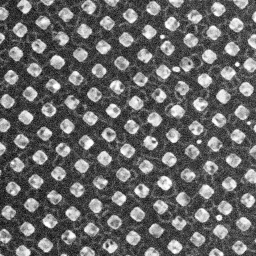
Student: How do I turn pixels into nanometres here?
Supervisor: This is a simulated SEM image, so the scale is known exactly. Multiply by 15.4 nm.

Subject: a regular array of raised bodies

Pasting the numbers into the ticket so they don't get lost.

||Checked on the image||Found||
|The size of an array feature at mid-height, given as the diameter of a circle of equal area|193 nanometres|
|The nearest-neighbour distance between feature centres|371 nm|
